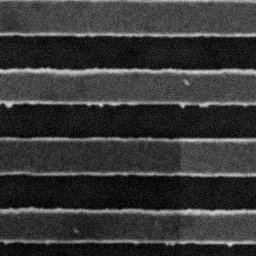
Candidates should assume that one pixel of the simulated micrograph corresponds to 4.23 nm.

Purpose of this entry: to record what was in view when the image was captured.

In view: lines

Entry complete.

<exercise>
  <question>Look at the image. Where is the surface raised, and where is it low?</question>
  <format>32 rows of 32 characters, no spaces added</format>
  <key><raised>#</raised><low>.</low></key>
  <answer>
################################
################################
################################
################################
.....................#..........
................................
................................
................................
................................
################################
################################
################################
################################
................................
................................
................................
................................
################################
################################
################################
################################
################################
................................
................................
................................
................................
################################
################################
################################
################################
................................
................................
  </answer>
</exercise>